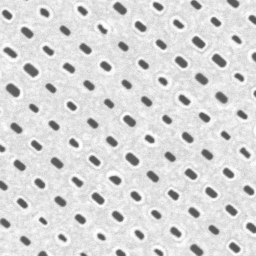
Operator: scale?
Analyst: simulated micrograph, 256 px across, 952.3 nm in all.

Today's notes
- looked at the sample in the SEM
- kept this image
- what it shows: a regular array of holes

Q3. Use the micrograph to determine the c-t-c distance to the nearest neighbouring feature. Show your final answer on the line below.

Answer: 96.9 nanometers